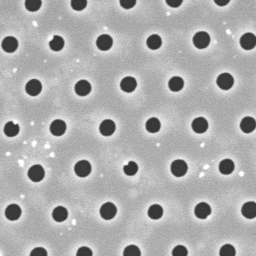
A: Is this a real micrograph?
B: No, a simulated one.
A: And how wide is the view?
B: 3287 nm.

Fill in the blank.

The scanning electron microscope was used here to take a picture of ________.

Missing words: a regular array of holes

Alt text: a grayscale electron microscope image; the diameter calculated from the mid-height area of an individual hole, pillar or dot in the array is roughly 227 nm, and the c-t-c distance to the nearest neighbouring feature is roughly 603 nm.